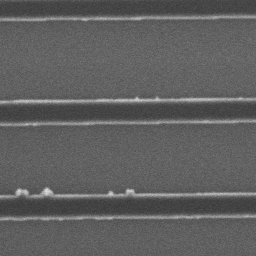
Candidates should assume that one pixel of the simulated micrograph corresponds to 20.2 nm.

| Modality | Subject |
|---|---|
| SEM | lines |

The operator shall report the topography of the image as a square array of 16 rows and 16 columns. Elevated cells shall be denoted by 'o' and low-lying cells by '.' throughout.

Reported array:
oooooooooooooooo
................
................
................
................
................
oooooooooooooooo
oooooooooooooooo
................
................
................
................
oooooooooooooooo
oooooooooooooooo
................
................